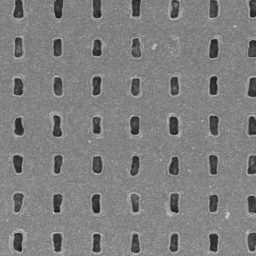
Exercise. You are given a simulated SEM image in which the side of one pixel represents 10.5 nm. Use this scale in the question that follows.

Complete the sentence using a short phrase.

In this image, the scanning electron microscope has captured a regular array of holes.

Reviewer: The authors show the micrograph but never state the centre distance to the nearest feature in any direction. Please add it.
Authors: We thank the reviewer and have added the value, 402 nm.